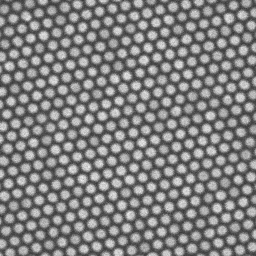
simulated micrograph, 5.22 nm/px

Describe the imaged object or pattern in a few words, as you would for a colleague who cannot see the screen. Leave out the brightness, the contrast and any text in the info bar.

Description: a regular array of raised bodies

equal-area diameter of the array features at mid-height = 44.1 nm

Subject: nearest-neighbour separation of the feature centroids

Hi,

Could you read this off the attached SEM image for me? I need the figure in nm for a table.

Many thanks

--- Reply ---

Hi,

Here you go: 67.4